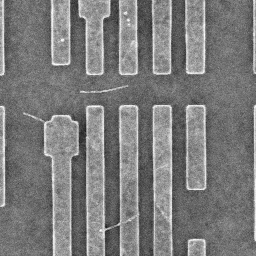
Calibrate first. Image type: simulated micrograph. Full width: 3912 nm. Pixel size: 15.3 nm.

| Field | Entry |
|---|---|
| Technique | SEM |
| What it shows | wiring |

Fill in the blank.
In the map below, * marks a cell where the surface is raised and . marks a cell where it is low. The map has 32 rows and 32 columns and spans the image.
.......**.****.**..**..***......
.......**.****.**..**..***......
.......**..**..**..**..***......
.......**..**..**..**..***......
.......**..**..**..**..***......
.......**..**..**..**..***......
.......**..**..**..**..***......
.......**..**..**..**..***......
...........**..**..**..***......
................................
................................
................................
................................
...........**..**..**..***......
*......*...**..**..**..***......
......****.**..**..**..***......
......****.**..**..**..***......
*.....****.**..**..**..***......
*.....****.**..**..**..***......
*.....***..**..**..**..***......
*......**..**..**..**..***......
*......**..**..**..**..***......
*......**..**..**..**..***......
*......**..**..**..**...*.......
*......**..**..**..**...........
.......**..**..**..**...........
.......**..**..**..**...........
.......**..**..**..**...........
.......**..**..**..**...........
.......**..**..**..**...........
.......**..**..**..**...**......
.......**..**..**..**...**......